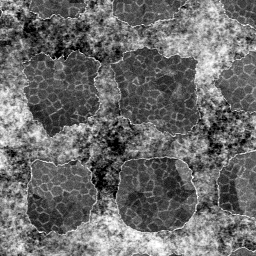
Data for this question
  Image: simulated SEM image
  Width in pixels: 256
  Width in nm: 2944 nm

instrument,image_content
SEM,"raised bodies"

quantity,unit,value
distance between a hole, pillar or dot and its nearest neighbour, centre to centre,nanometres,1110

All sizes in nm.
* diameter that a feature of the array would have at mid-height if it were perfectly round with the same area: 924